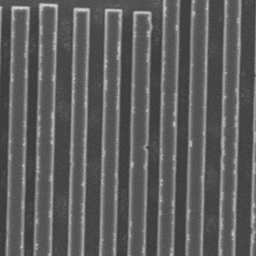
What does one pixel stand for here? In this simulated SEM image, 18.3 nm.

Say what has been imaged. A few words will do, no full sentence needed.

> parallel lines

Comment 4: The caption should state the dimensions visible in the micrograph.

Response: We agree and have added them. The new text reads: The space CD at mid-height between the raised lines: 254 nanometres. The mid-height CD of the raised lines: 288 nm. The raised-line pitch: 555 nanometers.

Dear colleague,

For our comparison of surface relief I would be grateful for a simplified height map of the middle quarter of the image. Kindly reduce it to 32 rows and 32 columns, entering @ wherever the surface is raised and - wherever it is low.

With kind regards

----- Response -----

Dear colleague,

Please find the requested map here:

--@@@@----@@@@---@@@@----@@@----
--@@@@----@@@@---@@@@----@@@----
--@@@@----@@@@---@@@@----@@@----
--@@@@----@@@@---@@@@----@@@----
--@@@@----@@@@---@@@@----@@@----
--@@@@----@@@@---@@@@---@@@@----
--@@@@----@@@@---@@@@---@@@@----
--@@@-----@@@@---@@@@---@@@@----
--@@@-----@@@@---@@@@---@@@@----
--@@@@----@@@@---@@@@---@@@@----
--@@@@----@@@@---@@@@---@@@@----
--@@@@----@@@@---@@@@---@@@@---@
--@@@@----@@@@---@@@@---@@@@---@
--@@@@----@@@----@@@@---@@@@---@
--@@@@----@@@----@@@@---@@@@---@
--@@@@----@@@----@@@@---@@@@---@
--@@@@----@@@----@@@@---@@@@---@
--@@@@----@@@----@@@@---@@@@---@
--@@@-----@@@----@@@@---@@@@---@
--@@@-----@@@----@@@@---@@@@---@
--@@@-----@@@----@@@@---@@@@---@
--@@@-----@@@----@@@@---@@@@---@
--@@@-----@@@----@@@@---@@@@---@
--@@@-----@@@----@@@@---@@@@---@
--@@@-----@@@----@@@@---@@@@---@
--@@@-----@@@----@@@@---@@@@---@
--@@@-----@@@----@@@@---@@@@---@
--@@@-----@@@----@@@@---@@@@---@
--@@@-----@@@----@@@@---@@@@---@
--@@@-----@@@----@@@----@@@@---@
--@@@-----@@@----@@@----@@@@---@
--@@@-----@@@---@@@@----@@@@---@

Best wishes